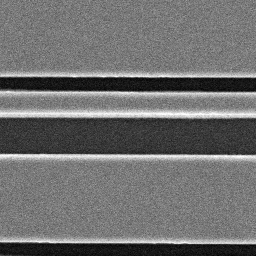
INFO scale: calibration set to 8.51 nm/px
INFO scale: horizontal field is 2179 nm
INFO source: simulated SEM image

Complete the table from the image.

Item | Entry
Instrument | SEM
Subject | lines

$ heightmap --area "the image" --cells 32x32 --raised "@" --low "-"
@@@@@@@@@@@@@@@@@@@@@@@@@@@@@@@@
@@@@@@@@@@@@@@@@@@@@@@@@@@@@@@@@
@@@@@@@@@@@@@@@@@@@@@@@@@@@@@@@@
@@@@@@@@@@@@@@@@@@@@@@@@@@@@@@@@
@@@@@@@@@@@@@@@@@@@@@@@@@@@@@@@@
@@@@@@@@@@@@@@@@@@@@@@@@@@@@@@@@
@@@@@@@@@@@@@@@@@@@@@@@@@@@@@@@@
@@@@@@@@@@@@@@@@@@@@@@@@@@@@@@@@
@@@@@@@@@@@@@@@@@@@@@@@@@@@@@@@@
------@@@@@@@@@@@@@@@@@@@@@@@@@@
--------------------------------
@@@@@@@-------------------------
@@@@@@@@@@@@@@@@@@@@@@@@@@@@@@@@
@@@@@@@@@@@@@@@@@@@@@@@@@@@@@@@@
--------------------------------
--------------------------------
--------------------------------
--------------------------------
--------------------------------
@@@@@@--------------------------
@@@@@@@@@@@@@@@@@@@@@@@@@@@@@@@@
@@@@@@@@@@@@@@@@@@@@@@@@@@@@@@@@
@@@@@@@@@@@@@@@@@@@@@@@@@@@@@@@@
@@@@@@@@@@@@@@@@@@@@@@@@@@@@@@@@
@@@@@@@@@@@@@@@@@@@@@@@@@@@@@@@@
@@@@@@@@@@@@@@@@@@@@@@@@@@@@@@@@
@@@@@@@@@@@@@@@@@@@@@@@@@@@@@@@@
@@@@@@@@@@@@@@@@@@@@@@@@@@@@@@@@
@@@@@@@@@@@@@@@@@@@@@@@@@@@@@@@@
@@@@@@@@@@@@@@@@@@@@@@@@@@@@@@@@
--------------------------------
--------------------------------